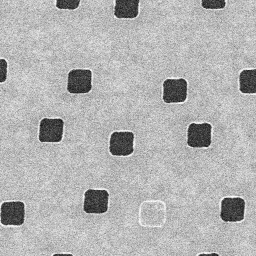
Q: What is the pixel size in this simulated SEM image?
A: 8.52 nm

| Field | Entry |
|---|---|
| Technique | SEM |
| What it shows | a regular array of holes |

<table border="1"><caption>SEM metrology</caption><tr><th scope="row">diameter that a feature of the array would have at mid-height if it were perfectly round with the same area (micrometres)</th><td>0.231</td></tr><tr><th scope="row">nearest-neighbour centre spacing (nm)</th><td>490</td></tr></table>